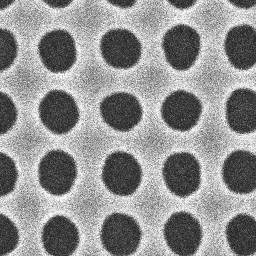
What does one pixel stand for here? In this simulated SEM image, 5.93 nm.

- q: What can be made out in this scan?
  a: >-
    a regular array of holes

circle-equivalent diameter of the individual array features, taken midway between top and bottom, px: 43.1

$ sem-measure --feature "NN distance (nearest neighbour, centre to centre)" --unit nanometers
360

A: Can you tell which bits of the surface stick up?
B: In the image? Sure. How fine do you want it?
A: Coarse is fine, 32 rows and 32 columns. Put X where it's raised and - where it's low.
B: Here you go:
--XXXX---XXXXX---XXXX---XXXXX---
XXXXXXXXXXXXXXXXXXXXXXXXXXXXXXXX
XXXXXXXXXXXXXXXXXXXXXXXXXXXXXXXX
XXXXXXXXXXXXXX-XXXXXX---XXXXX---
--XXX----XXXX----XXX-----XXX----
--XXX----XXX------XX-----XXX----
--XXX-----XXX-----XX-----XXX----
--XXX-----XXX----XXXX----XXXX---
-XXXXX---XXXXX--XXXXXX--XXXXX--X
XXXXXXXXXXXXXXXXXXXXXXXXXXXXXXXX
XXXXXXXXXXXXXXXXXXXXXXXXXXXXXXXX
XXXXXX--XXXXXXXXXXXXXX--XXXXX---
--XXX----XXXX----XXX-----XXX----
--XXX-----XX------XX-----XXX----
--XXX-----XXX-----XX-----XXX----
--XXX-----XXX----XXXX----XXX----
-XXXXX---XXXXXX-XXXXXX-XXXXXX---
XXXXXXXXXXXXXXXXXXXXXXXXXXXXXXXX
XXXXXXXXXXXXXXXXXXXXXXXXXXXXXXXX
-XXXX----XXXX----XXXX---XXXX----
--XXX-----XXX-----XX-----XXX----
--XXX-----XXX-----XX-----XXX----
--XXX----XXXX-----XX-----XXX----
--XXX----XXXX----XXXX----XXX----
-XXXXXX-XXXXXXX-XXXXXX--XXXXXXXX
XXXXXXXXXXXXXXXXXXXXXXXXXXXXXXXX
XXXXXXXXXXXXXXXXXXXXXX--XXXXXXXX
-XXXXX---XXXX----XXXX----XXXX---
--XXX-----XXX-----XX-----XXX----
--XXX-----XX------XX-----XXX----
--XXX-----XXX----XXXX----XXX----
--XXXX---XXXX----XXXXX---XXXX---